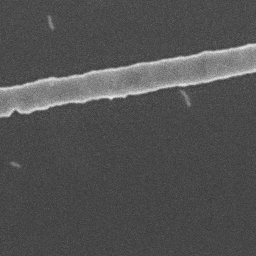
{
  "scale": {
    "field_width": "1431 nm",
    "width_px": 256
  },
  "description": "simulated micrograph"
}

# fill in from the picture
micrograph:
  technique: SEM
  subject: one or a few lines or trenches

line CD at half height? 152 nm